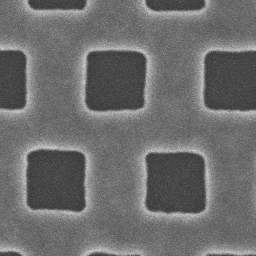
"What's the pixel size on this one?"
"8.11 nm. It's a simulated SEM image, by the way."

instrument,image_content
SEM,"holes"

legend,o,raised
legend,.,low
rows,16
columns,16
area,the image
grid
oo...oooo....ooo
oooooooooooooooo
oooooooooooooooo
..oooo...oooo...
..ooo....oooo...
..ooo....oooo...
.oooo....oooo...
oooooooooooooooo
oooooooooooooooo
oo...oooooo.oooo
oo...oooo....ooo
oo...oooo....ooo
oo...oooo....ooo
oooooooooooooooo
oooooooooooooooo
oooooooooooooooo